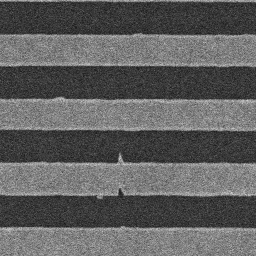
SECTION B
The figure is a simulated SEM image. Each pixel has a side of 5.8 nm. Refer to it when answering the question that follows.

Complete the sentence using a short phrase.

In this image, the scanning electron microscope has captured one or a few lines or trenches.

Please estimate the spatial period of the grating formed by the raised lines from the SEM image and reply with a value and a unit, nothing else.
64.5 pixels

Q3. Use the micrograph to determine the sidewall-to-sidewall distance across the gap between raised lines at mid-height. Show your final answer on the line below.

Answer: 202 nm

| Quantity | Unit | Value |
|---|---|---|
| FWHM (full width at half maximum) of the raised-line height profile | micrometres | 0.174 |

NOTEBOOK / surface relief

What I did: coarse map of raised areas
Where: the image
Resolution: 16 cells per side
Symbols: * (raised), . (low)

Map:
................
................
****************
****************
................
................
****************
****************
................
................
****************
****************
................
................
****************
****************